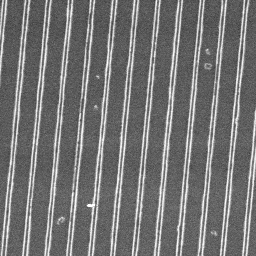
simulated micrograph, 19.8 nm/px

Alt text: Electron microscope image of parallel lines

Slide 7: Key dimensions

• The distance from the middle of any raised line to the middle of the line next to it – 432 nanometres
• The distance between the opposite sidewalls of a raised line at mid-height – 0.069 microns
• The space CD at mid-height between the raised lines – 18.2 px